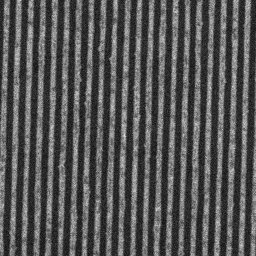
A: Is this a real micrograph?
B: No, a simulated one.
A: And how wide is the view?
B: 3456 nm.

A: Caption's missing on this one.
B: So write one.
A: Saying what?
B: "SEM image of parallel lines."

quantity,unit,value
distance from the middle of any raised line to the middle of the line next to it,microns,0.163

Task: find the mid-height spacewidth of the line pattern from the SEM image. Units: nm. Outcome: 101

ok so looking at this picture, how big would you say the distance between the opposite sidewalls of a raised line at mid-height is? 0.0675 micrometres